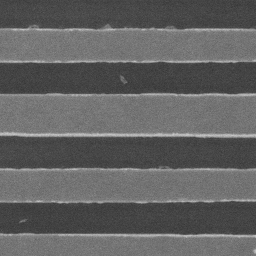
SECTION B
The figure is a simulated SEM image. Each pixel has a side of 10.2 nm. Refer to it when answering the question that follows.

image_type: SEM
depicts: lines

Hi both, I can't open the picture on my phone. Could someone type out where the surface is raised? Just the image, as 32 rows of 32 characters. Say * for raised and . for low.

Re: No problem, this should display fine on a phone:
................................
................................
................................
................................
********************************
********************************
********************************
********************************
................................
................................
................................
................................
********************************
********************************
********************************
********************************
********************************
................................
................................
................................
................................
********************************
********************************
********************************
********************************
................................
................................
................................
................................
********************************
********************************
********************************